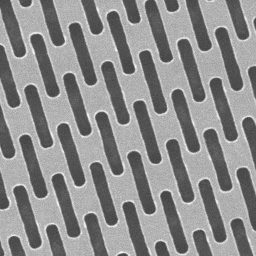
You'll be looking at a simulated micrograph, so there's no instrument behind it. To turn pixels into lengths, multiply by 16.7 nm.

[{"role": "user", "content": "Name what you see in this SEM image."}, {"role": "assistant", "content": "a regular array of holes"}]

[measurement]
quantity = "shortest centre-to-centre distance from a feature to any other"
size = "663 nm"